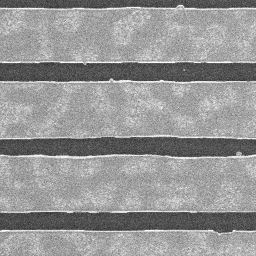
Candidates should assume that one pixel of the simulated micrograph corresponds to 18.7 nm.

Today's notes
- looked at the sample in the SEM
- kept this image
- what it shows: one or a few lines or trenches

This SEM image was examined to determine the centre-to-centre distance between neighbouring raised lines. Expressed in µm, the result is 1.39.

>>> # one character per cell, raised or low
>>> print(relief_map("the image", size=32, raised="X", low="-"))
--------------------------------
XXXXXXXXXXXXXXXXXXXXXXXXXXXXXXXX
XXXXXXXXXXXXXXXXXXXXXXXXXXXXXXXX
XXXXXXXXXXXXXXXXXXXXXXXXXXXXXXXX
XXXXXXXXXXXXXXXXXXXXXXXXXXXXXXXX
XXXXXXXXXXXXXXXXXXXXXXXXXXXXXXXX
XXXXXXXXXXXXXXXXXXXXXXXXXXXXXXXX
XXXXXXXXXXXXXXXXXXXXXXXXXXXXXXXX
--------------------------------
--------------------------------
XXXXXXXXXXXXXXXXXXXXXXXXXXXXXXXX
XXXXXXXXXXXXXXXXXXXXXXXXXXXXXXXX
XXXXXXXXXXXXXXXXXXXXXXXXXXXXXXXX
XXXXXXXXXXXXXXXXXXXXXXXXXXXXXXXX
XXXXXXXXXXXXXXXXXXXXXXXXXXXXXXXX
XXXXXXXXXXXXXXXXXXXXXXXXXXXXXXXX
XXXXXXXXXXXXXXXXXXXXXXXXXXXXXXXX
--------------------------------
--------------------------------
XX-----------XXXXXXXX----------X
XXXXXXXXXXXXXXXXXXXXXXXXXXXXXXXX
XXXXXXXXXXXXXXXXXXXXXXXXXXXXXXXX
XXXXXXXXXXXXXXXXXXXXXXXXXXXXXXXX
XXXXXXXXXXXXXXXXXXXXXXXXXXXXXXXX
XXXXXXXXXXXXXXXXXXXXXXXXXXXXXXXX
XXXXXXXXXXXXXXXXXXXXXXXXXXXXXXXX
--------------------------------
--------------------------------
--------------------------------
XXXXXXXXXXXXXXXXXXXXXXXXXXXXXXXX
XXXXXXXXXXXXXXXXXXXXXXXXXXXXXXXX
XXXXXXXXXXXXXXXXXXXXXXXXXXXXXXXX